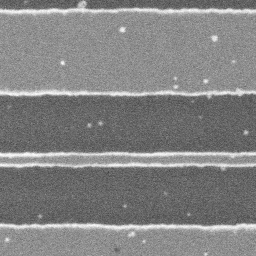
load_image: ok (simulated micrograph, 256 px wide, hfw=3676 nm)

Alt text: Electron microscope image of lines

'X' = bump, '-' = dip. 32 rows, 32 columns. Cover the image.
--------------------------------
XXXXXXXXXXXXXXXXXXXXXXXXXXXXXXXX
XXXXXXXXXXXXXXXXXXXXXXXXXXXXXXXX
XXXXXXXXXXXXXXXXXXXXXXXXXXXXXXXX
XXXXXXXXXXXXXXXXXXXXXXXXXXXXXXXX
XXXXXXXXXXXXXXXXXXXXXXXXXXXXXXXX
XXXXXXXXXXXXXXXXXXXXXXXXXXXXXXXX
XXXXXXXXXXXXXXXXXXXXXXXXXXXXXXXX
XXXXXXXXXXXXXXXXXXXXXXXXXXXXXXXX
XXXXXXXXXXXXXXXXXXXXXXXXXXXXXXXX
XXXXXXXXXXXXXXXXXXXXXXXXXXXXXXXX
XXXXXXXXXXXXXXXXXXXXXXXXXXXXXXXX
--------------------------------
--------------------------------
--------------------------------
--------------------------------
--------------------------------
--------------------------------
--------------------------------
XXXXXXXXXXXXXXXXXXXXXXXXXXXXXXXX
XXXXXXXXXXXXXXXXXXXXXXXXXXXXXXXX
--------------------------------
--------------------------------
--------------------------------
--------------------------------
--------------------------------
--------------------------------
--------------------------------
XXXXXXXXXXXXXXXXXXXXXXXXXXXXXXXX
XXXXXXXXXXXXXXXXXXXXXXXXXXXXXXXX
XXXXXXXXXXXXXXXXXXXXXXXXXXXXXXXX
XXXXXXXXXXXXXXXXXXXXXXXXXXXXXXXX